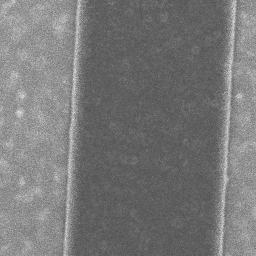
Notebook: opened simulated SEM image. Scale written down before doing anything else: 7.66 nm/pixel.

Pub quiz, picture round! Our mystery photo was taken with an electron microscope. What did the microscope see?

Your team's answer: one or a few lines or trenches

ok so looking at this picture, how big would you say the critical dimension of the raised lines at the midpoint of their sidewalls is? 1200 nanometers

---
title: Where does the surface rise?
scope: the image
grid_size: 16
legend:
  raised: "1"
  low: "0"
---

0000011111111110
0000011111111110
0000011111111110
0000011111111110
0000011111111100
0000011111111100
0000011111111100
0000111111111100
0000111111111100
0000111111111100
0000111111111100
0000111111111100
0000111111111100
0000111111111100
0000111111111100
0000111111111100